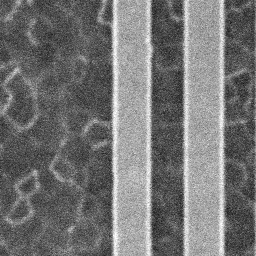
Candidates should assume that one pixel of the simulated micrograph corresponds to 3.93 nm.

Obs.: one or a few lines or trenches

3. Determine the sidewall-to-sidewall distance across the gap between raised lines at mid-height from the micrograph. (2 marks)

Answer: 144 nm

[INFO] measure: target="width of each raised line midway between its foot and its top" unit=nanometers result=138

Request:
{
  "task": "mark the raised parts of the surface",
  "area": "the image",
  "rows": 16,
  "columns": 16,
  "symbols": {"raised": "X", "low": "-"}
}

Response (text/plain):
-------XX---XX--
-------XX---XX--
-------XX---XX--
-------XX---XX--
-------XX---XX--
-------XX---XX--
-------XX---XX--
-------XX---XX--
-------XX---XX--
-------XX---XX--
-------XX---XX--
-------XX---XX--
-------XX---XX--
-------XX---XX--
-------XX---XX--
-------XX---XX--